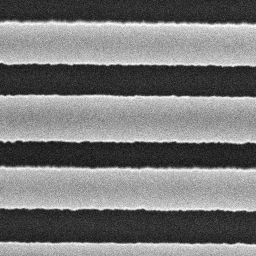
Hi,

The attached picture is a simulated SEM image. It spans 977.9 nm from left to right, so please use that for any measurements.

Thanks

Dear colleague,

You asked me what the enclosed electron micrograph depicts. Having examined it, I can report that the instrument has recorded lines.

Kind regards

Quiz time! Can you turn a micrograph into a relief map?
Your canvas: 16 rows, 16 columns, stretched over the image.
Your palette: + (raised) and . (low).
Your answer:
................
+++++++.........
++++++++++++++++
++++++++++++++++
................
................
++++++++++++++++
++++++++++++++++
++++++++++++++++
................
................
++++++++++++++++
++++++++++++++++
................
................
++++++++++++++++